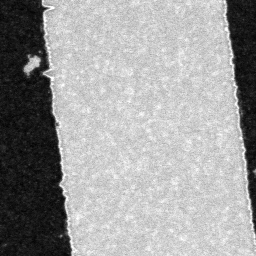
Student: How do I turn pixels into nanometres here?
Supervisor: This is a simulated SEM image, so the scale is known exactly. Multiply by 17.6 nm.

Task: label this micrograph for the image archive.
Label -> one or a few lines or trenches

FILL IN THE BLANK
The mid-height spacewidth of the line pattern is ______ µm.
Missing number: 3.19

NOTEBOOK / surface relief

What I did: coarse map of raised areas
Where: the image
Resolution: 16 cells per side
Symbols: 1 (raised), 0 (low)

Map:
1110000000000011
1110000000000011
1110000000000011
1100000000000011
1010000000000001
1110000000000001
1110000000000001
1111000000000001
1111000000000001
1111000000000001
1111000000000001
1111000000000001
1111000000000000
1111000000000000
1111000000000000
1111100000000000